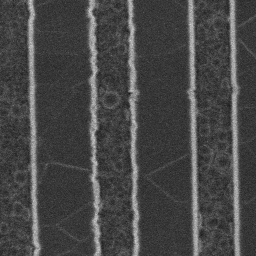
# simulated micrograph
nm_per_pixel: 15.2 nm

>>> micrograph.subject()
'one or a few lines or trenches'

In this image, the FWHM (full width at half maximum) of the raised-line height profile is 0.925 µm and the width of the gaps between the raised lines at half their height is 620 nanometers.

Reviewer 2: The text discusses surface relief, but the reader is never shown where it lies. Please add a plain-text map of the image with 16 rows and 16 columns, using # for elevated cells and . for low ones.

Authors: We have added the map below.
..####..####...#
..####..####...#
..####..####...#
..####..####...#
..####..####...#
..####..####...#
..####..####...#
..####..####...#
..####..####...#
..####..####...#
..####..####...#
..####..####...#
..####..####...#
..####..####...#
..####..####...#
..####..####...#